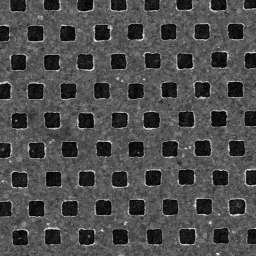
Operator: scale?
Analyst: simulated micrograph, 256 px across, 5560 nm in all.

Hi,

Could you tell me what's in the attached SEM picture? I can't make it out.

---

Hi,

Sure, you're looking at a regular array of holes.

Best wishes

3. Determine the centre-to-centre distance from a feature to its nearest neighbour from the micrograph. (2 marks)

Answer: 32.8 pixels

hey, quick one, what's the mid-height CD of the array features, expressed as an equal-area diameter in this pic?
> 377 nm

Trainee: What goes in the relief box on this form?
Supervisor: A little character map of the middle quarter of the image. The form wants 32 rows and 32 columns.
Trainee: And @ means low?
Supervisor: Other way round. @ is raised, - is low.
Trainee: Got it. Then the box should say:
@@@----@@@@@----@@@@----@@@@----
@@@@@@@@@@@@-@@@@@@@@@@@@@@@@@@@
@@@@@@@@@@@@@@@@@@@@@@@@@@@@@@@@
@@@@@@@@@@@@@@@@@@@@@@@@@@@@@@@@
@@@@@@@@@@@@@@@@@@@@@@@@@@-@@@@@
---@@@@----@@@@@----@@@@----@@@@
---@@@@----@@@@@----@@@@----@@@@
---@@@@-----@@@@----@@@@----@@@@
---@@@@@---@@@@@----@@@@@---@@@@
@@@@@@@@@@@@@@@@@@@@@@@@@@@@@@@@
@@@@@@@@@@@@@@@@@@@@@@@@@@@@@@@@
@@@@@@@@@@@@@@@@@@@@@@@@@@@@@@@@
@@@@---@@@@@----@@@@----@@@@@---
@@@@---@@@@@----@@@@----@@@@@---
@@@@----@@@@----@@@@----@@@@----
@@@@----@@@@----@@@@----@@@@@---
@@@@@@@@@@@@@@@@@@@@@@@@@@@@@@@@
@@@@@@@@@@@@@@@@@@@@@@@@@@@@@@@@
@@@@@@@@@@@@@@@@@@@@@@@@@@@@@@@@
---@@@@@---@@@@@@---@@@@@---@@@@
---@@@@@----@@@@----@@@@-----@@@
---@@@@@----@@@@----@@@@-----@@@
---@@@@@----@@@@----@@@@-----@@@
@@@@@@@@@@@@@@@@@@@@@@@@@@@@@@@@
@@@@@@@@@@@@@@@@@@@@@@@@@@@@@@@@
@@@@@@@@@@@@@@@@@@@@@@@@@@@@@@@@
@@@@@@@@@@@@@@@@@@@@@--@@@@@@---
@@@@----@@@@----@@@@----@@@@@---
@@@@----@@@@----@@@@----@@@@@---
@@@@----@@@@----@@@@----@@@@@---
@@@@---@@@@@----@@@@@---@@@@@@@@
@@@@@@@@@@@@@@@@@@@@@@@@@@@@@@@@